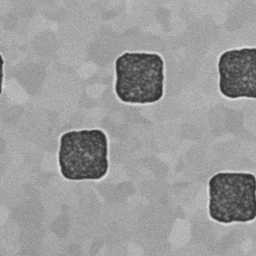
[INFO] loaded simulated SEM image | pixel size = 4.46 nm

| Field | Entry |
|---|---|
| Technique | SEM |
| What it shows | holes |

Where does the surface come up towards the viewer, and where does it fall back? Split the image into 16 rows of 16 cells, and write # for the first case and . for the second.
################
################
################
########..####..
#######...####..
#######...####..
################
################
####...#########
####...#########
####...#########
#############...
#############...
#############...
################
################